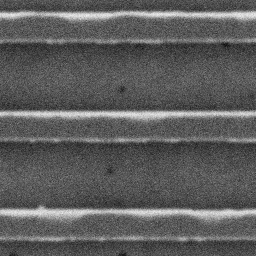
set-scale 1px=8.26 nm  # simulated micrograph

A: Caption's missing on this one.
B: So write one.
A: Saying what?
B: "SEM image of lines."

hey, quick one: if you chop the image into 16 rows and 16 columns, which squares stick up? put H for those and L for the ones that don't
LLLLLLLLLLLLLLLL
HHHHHHHHHHHHHHHH
HHHHHHHHHHHHHHHH
LLLLLLLLLLLLLLLL
LLLLLLLLLLLLLLLL
LLLLLLLLLLLLLLLL
LLLLLLLLLLLLLLLL
HHHHHHHHHHHHHHHH
HHHHHHHHHHHHHHHH
LLLLLLLLLLLLLLLL
LLLLLLLLLLLLLLLL
LLLLLLLLLLLLLLLL
LLLLLLLLLLLLLLLL
HHHHHHHHHHHHHHHH
HHHHHHHHHHHHHHHH
LLLLLLLLLLLLLLLL